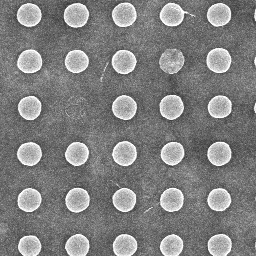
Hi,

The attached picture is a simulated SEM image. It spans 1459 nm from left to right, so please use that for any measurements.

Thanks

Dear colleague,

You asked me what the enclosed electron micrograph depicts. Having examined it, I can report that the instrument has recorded a regular array of raised bodies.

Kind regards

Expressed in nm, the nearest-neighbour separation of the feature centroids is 263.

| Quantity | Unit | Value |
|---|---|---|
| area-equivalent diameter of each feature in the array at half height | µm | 0.133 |